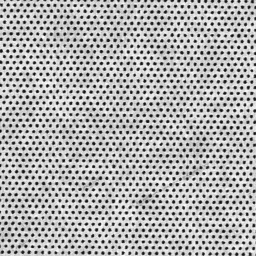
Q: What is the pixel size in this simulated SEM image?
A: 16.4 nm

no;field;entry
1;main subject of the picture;a regular array of holes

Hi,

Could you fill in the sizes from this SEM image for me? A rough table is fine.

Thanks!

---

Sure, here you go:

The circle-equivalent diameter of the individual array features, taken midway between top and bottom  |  61.3 nanometers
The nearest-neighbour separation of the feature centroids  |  104 nanometres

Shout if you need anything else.